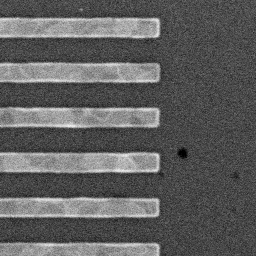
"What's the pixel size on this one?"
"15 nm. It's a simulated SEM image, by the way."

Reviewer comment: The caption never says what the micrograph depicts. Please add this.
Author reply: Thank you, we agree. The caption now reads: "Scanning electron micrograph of wiring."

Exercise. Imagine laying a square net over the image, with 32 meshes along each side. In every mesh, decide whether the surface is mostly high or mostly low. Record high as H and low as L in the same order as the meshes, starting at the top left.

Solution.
LLLLLLLLLLLLLLLLLLLLLLLLLLLLLLLL
LLLLLLLLLLLLLLLLLLLLLLLLLLLLLLLL
HHHHHHHHHHHHHHHHHHHLLLLLLLLLLLLL
HHHHHHHHHHHHHHHHHHHHLLLLLLLLLLLL
LHHHLHHHLLLLLLLHHHHLLLLLLLLLLLLL
LLLLLLLLLLLLLLLLLLLLLLLLLLLLLLLL
LLLLLLLLLLLLLLLLLLLLLLLLLLLLLLLL
LLLLLLLLLLLLLLLLLLLLLLLLLLLLLLLL
HHHHHHHHHHHHHHHHHHHHLLLLLLLLLLLL
HHHHHHHHHHHHHHHHHHHHLLLLLLLLLLLL
LLLLLLLLLLLLLLLLLLLLLLLLLLLLLLLL
LLLLLLLLLLLLLLLLLLLLLLLLLLLLLLLL
LLLLLLLLLLLLLLLLLLLLLLLLLLLLLLLL
LLLLLLLLLLLLLLLLLLLLLLLLLLLLLLLL
HHHHHHHHHHHHHHHHHHHHLLLLLLLLLLLL
HHHHHHHHHHHHHHHHHHHHLLLLLLLLLLLL
LLLLLLLLLLLLLLLLLLLLLLLLLLLLLLLL
LLLLLLLLLLLLLLLLLLLLLLLLLLLLLLLL
LLLLLLLLLLLLLLLLLLLLLLLLLLLLLLLL
HHHHHHHHHHHHHHHHHHHHLLLLLLLLLLLL
HHHHHHHHHHHHHHHHHHHHLLLLLLLLLLLL
LLLLLLLLLLLLLLLLLLLLLLLLLLLLLLLL
LLLLLLLLLLLLLLLLLLLLLLLLLLLLLLLL
LLLLLLLLLLLLLLLLLLLLLLLLLLLLLLLL
LLLLLLLLLLLLLLLLLLLLLLLLLLLLLLLL
HHHHHHHHHHHHHHHHHHHHLLLLLLLLLLLL
HHHHHHHHHHHHHHHHHHHHLLLLLLLLLLLL
LLLLLLLLLLLLLLLLLLLLLLLLLLLLLLLL
LLLLLLLLLLLLLLLLLLLLLLLLLLLLLLLL
LLLLLLLLLLLLLLLLLLLLLLLLLLLLLLLL
LLHHLLLLLLLLLLLLLLLLLLLLLLLLLLLL
HHHHHHHHHHHHHHHHHHHHLLLLLLLLLLLL